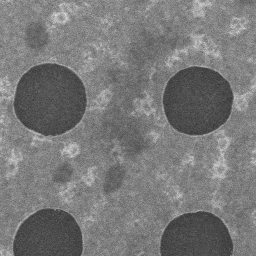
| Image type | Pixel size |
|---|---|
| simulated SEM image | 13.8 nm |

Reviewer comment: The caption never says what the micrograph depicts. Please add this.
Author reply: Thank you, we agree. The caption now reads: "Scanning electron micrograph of holes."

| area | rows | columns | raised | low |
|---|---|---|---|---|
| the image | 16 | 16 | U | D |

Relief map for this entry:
UUUUUUUUUUUUUUUU
UUUUUUUUUUUUUUUU
UUUUUUUUUUUUUUUU
UUUUUUUUUUUUUUUU
UUDDDUUUUUUDDDUU
UDDDDUUUUUDDDDUU
UDDDDUUUUUDDDDDU
UDDDDUUUUUDDDDUU
UUUUUUUUUUUUUUUU
UUUUUUUUUUUUUUUU
UUUUUUUUUUUUUUUU
UUUUUUUUUUUUUUUU
UUUUUUUUUUUUUUUU
UUDDUUUUUUUDDDUU
UDDDDUUUUUDDDDUU
UDDDDUUUUUDDDDDU